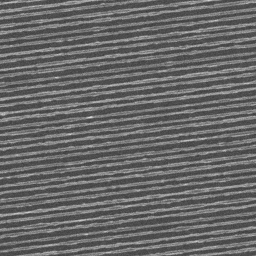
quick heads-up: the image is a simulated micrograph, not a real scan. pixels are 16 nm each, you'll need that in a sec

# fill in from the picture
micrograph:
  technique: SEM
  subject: parallel lines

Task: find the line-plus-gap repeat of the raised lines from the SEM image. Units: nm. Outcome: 116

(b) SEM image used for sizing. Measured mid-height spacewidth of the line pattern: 75.5 nanometres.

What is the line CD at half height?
37.8 nm